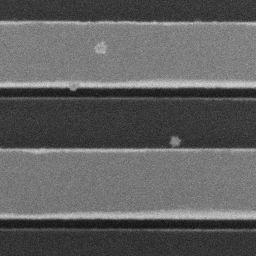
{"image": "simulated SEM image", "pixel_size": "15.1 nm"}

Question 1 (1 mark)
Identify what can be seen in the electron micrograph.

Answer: lines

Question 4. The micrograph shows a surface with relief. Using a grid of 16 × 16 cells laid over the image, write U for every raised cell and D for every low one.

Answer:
DDDDDDDDDDDDDDDD
UUUUUUUUUUUUUUUU
UUUUUUUUUUUUUUUU
UUUUUUUUUUUUUUUU
UUUUUUUUUUUUUUUU
DDDDUDDDDDDDDDDD
DDDDDDDDDDDDDDDD
DDDDDDDDDDDDDDDD
DDDDDDDDDDDDDDDD
UUUUUUUUUUUUUUUU
UUUUUUUUUUUUUUUU
UUUUUUUUUUUUUUUU
UUUUUUUUUUUUUUUU
UUUUUUUUUUUUUUUU
DDDDDDDDDDDDDDDD
DDDDDDDDDDDDDDDD